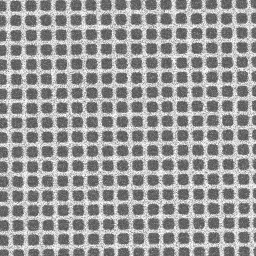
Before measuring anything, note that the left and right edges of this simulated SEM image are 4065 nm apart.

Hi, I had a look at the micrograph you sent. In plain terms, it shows a regular array of holes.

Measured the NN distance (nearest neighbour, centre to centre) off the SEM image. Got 230 nanometers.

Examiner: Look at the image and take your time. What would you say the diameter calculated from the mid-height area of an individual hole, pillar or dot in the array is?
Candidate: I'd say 0.197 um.